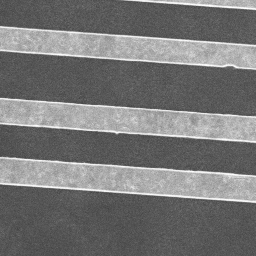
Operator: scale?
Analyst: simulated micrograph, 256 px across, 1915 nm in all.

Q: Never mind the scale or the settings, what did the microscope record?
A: one or a few lines or trenches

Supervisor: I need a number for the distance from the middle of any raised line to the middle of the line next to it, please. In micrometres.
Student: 0.492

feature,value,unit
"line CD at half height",193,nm